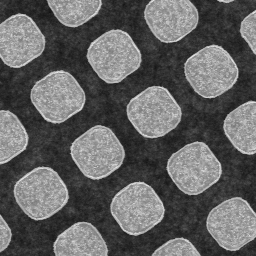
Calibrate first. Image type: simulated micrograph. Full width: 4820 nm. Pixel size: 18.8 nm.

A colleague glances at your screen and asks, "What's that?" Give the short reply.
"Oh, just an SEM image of a regular array of raised bodies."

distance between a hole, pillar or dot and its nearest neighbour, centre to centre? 68.5 pixels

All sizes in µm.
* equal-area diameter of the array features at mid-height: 0.952